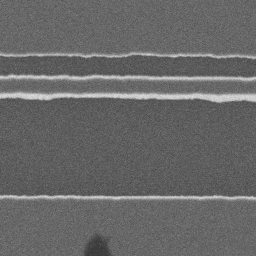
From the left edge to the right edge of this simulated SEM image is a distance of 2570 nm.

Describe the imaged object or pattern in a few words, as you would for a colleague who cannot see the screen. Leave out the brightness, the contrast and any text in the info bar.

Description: lines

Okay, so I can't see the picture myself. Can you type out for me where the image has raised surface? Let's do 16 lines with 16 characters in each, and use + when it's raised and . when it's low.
++++++++++++++++
++++++++++++++++
++++++++++++++++
++++++++++++++++
++++++++++++++++
++++++++++++++++
................
................
................
................
................
................
++++++++++++++++
++++++++++++++++
++++++++++++++++
++++++++++++++++